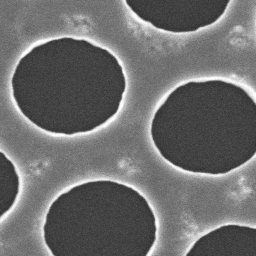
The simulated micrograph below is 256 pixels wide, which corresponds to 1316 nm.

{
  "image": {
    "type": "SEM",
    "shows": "holes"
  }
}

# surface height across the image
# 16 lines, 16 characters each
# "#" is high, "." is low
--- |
########......##
#########....###
###..###########
##.....#########
#.......########
#.......###....#
#......###......
##.....###......
#########.......
##########......
.##########....#
.####...########
.##......#######
###.......######
###.......###...
###......###....